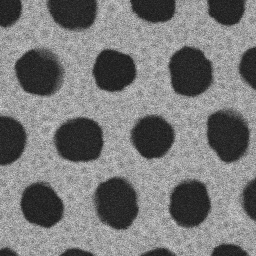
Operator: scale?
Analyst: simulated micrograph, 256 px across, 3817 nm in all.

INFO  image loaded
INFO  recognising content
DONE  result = a regular array of holes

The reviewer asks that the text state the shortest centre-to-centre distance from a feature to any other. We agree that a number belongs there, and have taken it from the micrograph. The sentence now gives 1.1 micrometres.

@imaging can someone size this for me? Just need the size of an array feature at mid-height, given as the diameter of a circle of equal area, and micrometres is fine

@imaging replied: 0.705